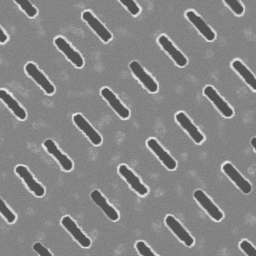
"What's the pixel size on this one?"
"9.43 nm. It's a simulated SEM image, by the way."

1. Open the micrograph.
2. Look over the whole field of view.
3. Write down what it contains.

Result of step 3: a regular array of holes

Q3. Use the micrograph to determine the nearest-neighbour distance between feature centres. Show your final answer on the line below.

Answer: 0.362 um